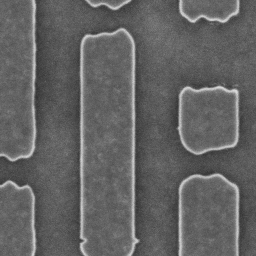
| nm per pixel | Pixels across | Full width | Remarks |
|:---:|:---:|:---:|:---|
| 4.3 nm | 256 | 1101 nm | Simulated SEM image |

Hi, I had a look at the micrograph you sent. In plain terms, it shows one or a few lines or trenches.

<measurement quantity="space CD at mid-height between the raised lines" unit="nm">202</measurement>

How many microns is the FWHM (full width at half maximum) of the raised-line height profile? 0.227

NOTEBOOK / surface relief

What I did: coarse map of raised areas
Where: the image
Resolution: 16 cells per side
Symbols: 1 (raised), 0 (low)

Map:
1100000000011110
1100000000000000
1100011100000000
1100011100000000
1100011100000000
1100011100000100
1100011100011110
1100011100011110
1100011100011110
1100011100001000
0000011100000000
1000011100001100
1100011100011110
1100011100011110
1100011100011110
1100011100011110